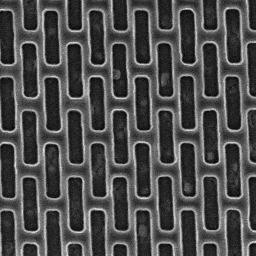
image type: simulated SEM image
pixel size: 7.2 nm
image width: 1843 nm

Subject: a regular array of holes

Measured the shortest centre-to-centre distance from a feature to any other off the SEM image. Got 286 nm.